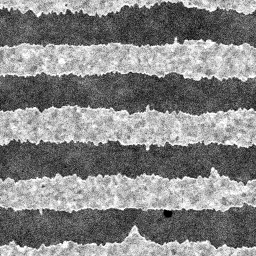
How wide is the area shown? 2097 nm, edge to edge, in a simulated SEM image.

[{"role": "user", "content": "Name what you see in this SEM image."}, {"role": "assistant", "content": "one or a few lines or trenches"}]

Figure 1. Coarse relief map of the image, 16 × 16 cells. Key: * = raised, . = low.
.*******.....***
................
................
****************
****************
................
................
****************
****************
................
................
****************
****************
................
........*.......
**************..